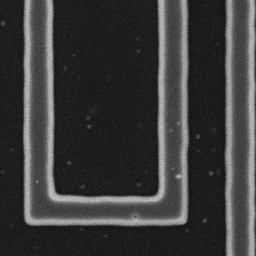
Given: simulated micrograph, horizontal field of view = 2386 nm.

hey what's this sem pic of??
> groups of lines, slits or small figures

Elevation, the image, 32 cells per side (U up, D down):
DDDUUUDDDDDDDDDDDDDDUUUDDDDDDUUU
DDDUUUDDDDDDDDDDDDDDUUUDDDDDDUUU
DDDUUUDDDDDDDDDDDDDDUUUDDDDDDUUU
DDDUUUDDDDDDDDDDDDDDUUUDDDDDDUUU
DDDUUUDDDDDDDDDDDDDDUUUDDDDDDUUU
DDDUUUDDDDDDDDDDDDDDUUUDDDDDDUUU
DDDUUUDDDDDDDDDDDDDDUUUDDDDDDUUD
DDDUUUDDDDDDDDDDDDDDUUUDDDDDDUUD
DDDUUUDDDDDDDDDDDDDDUUUDDDDDDUUD
DDDUUUDDDDDDDDDDDDDDUUUDDDDDDUUD
DDDUUUDDDDDDDDDDDDDDUUUDDDDDDUUU
DDDUUUDDDDDDDDDDDDDDUUUDDDDDDUUU
DDDUUUDDDDDDDDDDDDDDUUUDDDDDDUUD
DDDUUUDDDDDDDDDDDDDDUUUDDDDDDUUD
DDDUUUDDDDDDDDDDDDDDUUUDDDDDDUUU
DDDUUUDDDDDDDDDDDDDDUUUDDDDDDUUU
DDDUUUDDDDDDDDDDDDDDUUUDDDDDDUUU
DDDUUUDDDDDDDDDDDDDDUUUDDDDDDUUU
DDDUUUDDDDDDDDDDDDDDUUUDDDDDDUUU
DDDUUUDDDDDDDDDDDDDDUUUDDDDDUUUU
DDDUUUDDDDDDDDDDDDDDUUUDDDDDDUUD
DDDUUUDDDDDDDDDDDDDDUUUDDDDDDUUD
DDDUUUDDDDDDDDDDDDDDUUUDDDDDDUUD
DDDUUUDDDDDDDDDDDDDDUUUDDDDDUUUU
DDDUUUUDDDDDDDDDDDDDUUUDDDDDUUUD
DDDUUUUUUUUUUUUUUUUUUUUDDDDDDUUD
DDDUUUUUUUUUUUUUUUUUUUUDDDDDDUUU
DDDDUUUUUUUUUUUUUUUUUUUDDDDDDUUU
DDDDDDDDDDDDDDDDDDDDDDDDDDDDDUUD
DDDDDDDDDDDDDDDDDDDDDDDDDDDDDUUU
DDDDDDDDDDDDDDDDDDDDDDDDDDDDDUUU
DDDDDDDDDDDDDDDDDDDDDDDDDDDDDUUU